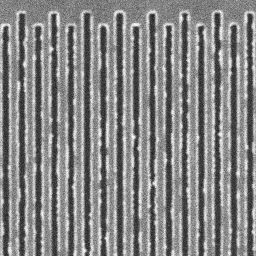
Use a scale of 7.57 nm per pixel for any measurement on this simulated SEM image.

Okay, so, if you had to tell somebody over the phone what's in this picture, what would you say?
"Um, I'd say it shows parallel lines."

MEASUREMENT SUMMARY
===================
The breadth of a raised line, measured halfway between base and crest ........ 74.8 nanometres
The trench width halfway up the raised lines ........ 0.0454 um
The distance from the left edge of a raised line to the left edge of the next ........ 0.123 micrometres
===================